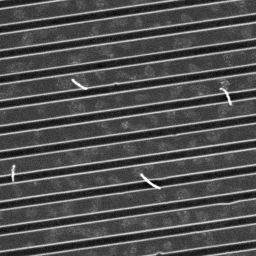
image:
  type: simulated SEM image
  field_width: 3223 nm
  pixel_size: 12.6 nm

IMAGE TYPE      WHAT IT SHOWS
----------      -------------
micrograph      parallel lines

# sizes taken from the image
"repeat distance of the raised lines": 314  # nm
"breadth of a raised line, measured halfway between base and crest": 206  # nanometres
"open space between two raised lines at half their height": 107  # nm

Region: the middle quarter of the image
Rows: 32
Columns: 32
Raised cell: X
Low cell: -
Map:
X----------------XXXXXXXXXXXXXXX
----------XXXXXXXXXXXXXXXXXXXXXX
-XXXXXXXXXXXXXXXXXXXXXXXXXXXXX--
XXXXXXXXXXXXXXXXXXXXXXXX--------
XXXXXXXXXXXXXXXXX---------------
XXXXXXXXXX----------------XXXXXX
XXX----------------XXXXXXXXXXXXX
------------XXXXXXXXXXXXXXXXXXXX
-----XXXXXXXXXXXXXXXXXXXXXXXXXXX
XXXXXXXXXXXXXXXXXXXXXXXXXX------
XXXXXXXXXXXXXXXXXXX-------------
XXXXXXXXXXXX----------------XXXX
XXXXX----------------XXXXXXXXXXX
--------------XXXXXXXXXXXXXXXXXX
-------XXXXXXXXXXXXXXXXXXXXXXXXX
XXXXXXXXXXXXXXXXXXXXXXXXXXXX----
XXXXXXXXXXXXXXXXXXXXX-----------
XXXXXXXXXXXXXX----------------XX
XXXXXXX----------------XXXXXXXXX
----------------XXXXXXXXXXXXXXXX
---------XXXXXXXXXXXXXXXXXXXXXXX
--XXXXXXXXXXXXXXXXXXXXXXXXXXXX--
XXXXXXXXXXXXXXXXXXXXXXX---------
XXXXXXXXXXXXXXXX----------------
XXXXXXXXX----------------XXXXXXX
XX----------------XXXXXXXXXXXXXX
-----------XXXXXXXXXXXXXXXXXXXXX
----XXXXXXXXXXXXXXXXXXXXXXXXXXXX
XXXXXXXXXXXXXXXXXXXXXXXXXX------
XXXXXXXXXXXXXXXXXX---X----------
XXXXXXXXXXX----------------XXXXX
XXXX----------------XXXXXXXXXXXX